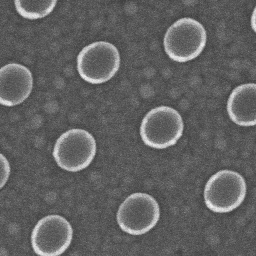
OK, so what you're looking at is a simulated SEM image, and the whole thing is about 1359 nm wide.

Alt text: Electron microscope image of raised bodies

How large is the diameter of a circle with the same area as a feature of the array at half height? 220 nanometers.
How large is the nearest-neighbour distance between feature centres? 474 nm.